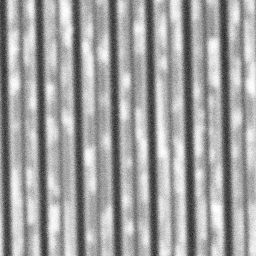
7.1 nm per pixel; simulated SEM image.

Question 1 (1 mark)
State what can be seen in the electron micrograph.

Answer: parallel lines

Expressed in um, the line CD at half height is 0.0665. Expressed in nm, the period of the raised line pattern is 130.